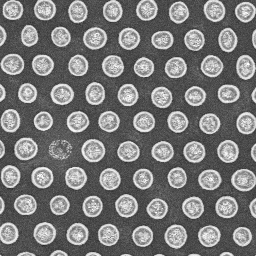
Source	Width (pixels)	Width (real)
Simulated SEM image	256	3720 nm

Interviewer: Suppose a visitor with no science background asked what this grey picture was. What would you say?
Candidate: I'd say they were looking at a regular array of raised bodies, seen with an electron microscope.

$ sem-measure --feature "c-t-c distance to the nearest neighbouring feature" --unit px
31.4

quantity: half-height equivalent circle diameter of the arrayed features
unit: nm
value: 286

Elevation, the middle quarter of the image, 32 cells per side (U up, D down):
DUUUUUDDDDUUUUUDDDUUUUDDDUUUUUUD
DDUUUUDDDDUUUUUDDDUUUUDDDUUUUUDD
DDUUUDDDDDDUUUDDDDUUUUDDDDUUUUDD
DDDDDDDDDDDDDDDDDDDDDDDDDDDDDDDD
DDDDDDDDDDDDDDDDDDDDDDDDDDDDDDDD
UDDDDDDUUDDDDDDUUDDDDDDDDDDDDDDD
UUDDDDUUUUDDDDUUUUDDDDDUUUDDDDDU
UUDDDDUUUUDDDDUUUUDDDDUUUUUDDDUU
UUDDDDUUUUDDDDUUUUDDDDUUUUUDDDUU
UDDDDDUUUDDDDDUUUUDDDDDUUUUDDDDU
DDDDDDDDDDDDDDDDDDDDDDDUUUDDDDDD
DDDDDDDDDDDDDDDDDDDDDDDDDDDDDDDD
DDUUUDDDDDUUUDDDDDDUUUDDDDDUUDDD
DUUUUUDDDUUUUDDDDDUUUUDDDDUUUUUD
DUUUUUDDDUUUUUDDDDUUUUDDDDUUUUUD
DUUUUUDDDUUUUDDDDDUUUUDDDDDUUUUD
DDUUUDDDDDUUDDDDDDDUUDDDDDDUUUDD
DDDDDDDDDDDDDDDDDDDDDDDDDDDDDDDD
DDDDDDDDDDDDDDDDDDDDDDDDDDDDDDDD
DDDDDDUUUDDDDDDDDDDDDDDDDDDDDDDD
DDDDDUUUUUDDDDUUUUDDDDDUUUUDDDDU
DDDDDUUUUUDDDDUUUUUDDDUUUUUDDDUU
DDDDDUUUUUDDDDUUUUUDDDUUUUUDDDUU
DDDDDUUUUDDDDDUUUUDDDDDUUUUDDDDU
DDDDDDDDDDDDDDDDDDDDDDDDDDDDDDDD
DDDDDDDDDDDDDDDDDDDDDDDDDDDDDDDD
DUUUDDDDDDUUDDDDDDDDDDDDDDDUUDDD
DUUUUDDDDUUUUDDDDDUUUUDDDDUUUUDD
DUUUUDDDDUUUUUDDDDUUUUDDDDUUUUDD
DUUUUDDDDUUUUUDDDDUUUUDDDDDUUUDD
DUUUDDDDDDUUUDDDDDUUUDDDDDDUUUDD
DDDDDDDDDDDDDDDDDDDDDDDDDDDDDDDD